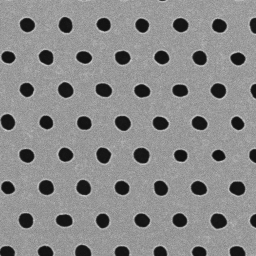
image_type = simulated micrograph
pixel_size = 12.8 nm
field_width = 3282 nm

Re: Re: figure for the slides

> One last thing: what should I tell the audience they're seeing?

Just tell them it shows a regular array of holes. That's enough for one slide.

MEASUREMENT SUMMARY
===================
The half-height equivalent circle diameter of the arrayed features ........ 189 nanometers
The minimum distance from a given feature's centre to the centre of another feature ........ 0.478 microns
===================